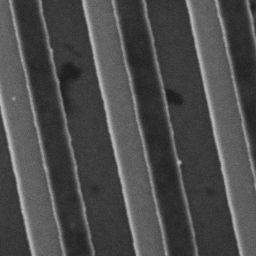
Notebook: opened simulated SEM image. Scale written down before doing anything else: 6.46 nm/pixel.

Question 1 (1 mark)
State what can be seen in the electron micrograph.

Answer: lines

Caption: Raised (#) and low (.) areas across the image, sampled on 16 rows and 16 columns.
###..####...####
###..####...####
###...####..####
###...####..####
####..####...###
####..####...###
####...###...###
####...####..###
####...####..###
.####..####...##
.####..####...##
.####...###...##
.####...####..##
.####...####..##
..####..####...#
..####..####...#